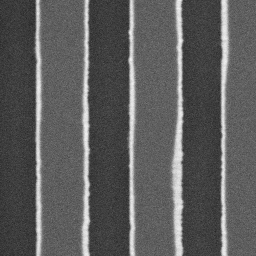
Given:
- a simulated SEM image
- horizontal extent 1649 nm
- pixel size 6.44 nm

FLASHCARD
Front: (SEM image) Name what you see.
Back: lines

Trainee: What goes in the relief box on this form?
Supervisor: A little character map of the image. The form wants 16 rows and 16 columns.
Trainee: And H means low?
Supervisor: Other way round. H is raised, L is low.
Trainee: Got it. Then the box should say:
LLHHHLLLHHHLLLHH
LLHHHLLLHHHLLLHH
LLHHHLLLHHHLLLHH
LLHHHLLLHHHLLLHH
LLHHHLLLHHHLLLHH
LLHHHLLLHHHLLLHH
LLHHHLLLHHHLLLHH
LLHHHLLLHHHLLLHH
LLHHHLLLHHHLLLHH
LLHHHLLLHHHLLLHH
LLHHHLLLHHHLLLHH
LLHHHLLLHHHLLLHH
LLHHHLLLHHHLLLHH
LLHHHLLLHHHLLLHH
LLHHHLLLHHHLLLHH
LLHHHLLLHHHLLLHH